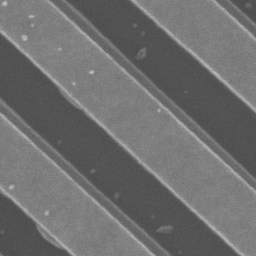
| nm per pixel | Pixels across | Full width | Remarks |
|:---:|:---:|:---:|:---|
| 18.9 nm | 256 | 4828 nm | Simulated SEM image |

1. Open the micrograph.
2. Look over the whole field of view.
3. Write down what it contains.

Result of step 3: lines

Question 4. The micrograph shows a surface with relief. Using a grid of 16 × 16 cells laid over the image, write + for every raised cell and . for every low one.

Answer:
++++.....++++++.
++++++....++++++
.++++++....+++++
..++++++....++++
...++++++....+++
....++++++....++
.....++++++....+
+.....++++++....
++.....++++++...
+++.....++++++..
+++++....++++++.
++++++....++++++
.++++++....+++++
..++++++....++++
..+++++++....+++
....++++++.....+